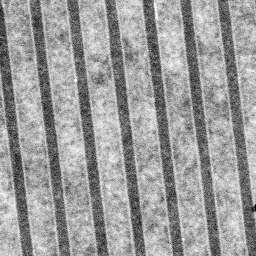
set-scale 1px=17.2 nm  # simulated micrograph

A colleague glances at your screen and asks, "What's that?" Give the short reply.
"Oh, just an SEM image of parallel lines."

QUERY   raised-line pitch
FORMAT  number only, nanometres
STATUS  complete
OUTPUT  643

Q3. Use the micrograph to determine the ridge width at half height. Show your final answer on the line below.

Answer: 216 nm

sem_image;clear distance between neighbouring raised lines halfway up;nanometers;433